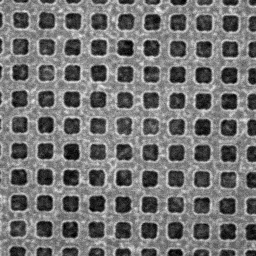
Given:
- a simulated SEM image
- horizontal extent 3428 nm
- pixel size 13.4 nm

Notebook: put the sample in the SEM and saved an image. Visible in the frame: a regular array of holes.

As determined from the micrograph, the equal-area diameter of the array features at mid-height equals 0.25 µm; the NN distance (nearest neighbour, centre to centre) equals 347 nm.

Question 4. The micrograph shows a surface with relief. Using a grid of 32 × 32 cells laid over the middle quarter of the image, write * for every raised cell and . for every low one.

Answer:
....***...****..*****..****...**
....**.....**.....**....**.....*
....***....**.....**....**.....*
....***....**....***....**.....*
*******...****...***....**....**
********************************
********************************
....***....**....***....***...**
....**.....**....***....**....**
....**.....**....***....**....**
....***...***....***....**....**
***************************..***
********************************
*...***...****...****..****..***
....**.....**....***....**....**
....**.....**....***....**....**
....**.....**....***....**....**
...****...****...***...***....**
********************************
********************************
....**.....**....***....**....**
....**.....**....**.....**....**
....**.....**....**.....**....**
....**.....**....**.....**....**
***************************..***
********************************
....***...****..****..*****..***
....**....***....**.....**....**
....**....***....**.....**....**
....**....***....**.....**....**
*..****...***...****...***....**
********************************